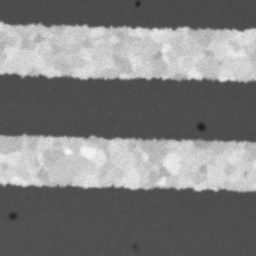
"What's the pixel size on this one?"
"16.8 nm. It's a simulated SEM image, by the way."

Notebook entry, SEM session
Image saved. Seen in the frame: one or a few lines or trenches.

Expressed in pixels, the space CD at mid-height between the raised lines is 61.6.